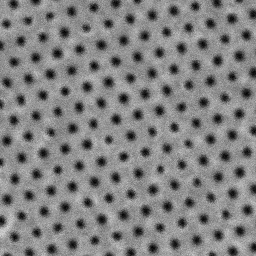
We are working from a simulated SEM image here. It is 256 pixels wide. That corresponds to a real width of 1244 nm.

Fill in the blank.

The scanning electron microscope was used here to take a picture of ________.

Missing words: a regular array of holes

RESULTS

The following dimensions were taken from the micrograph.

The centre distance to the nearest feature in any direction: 106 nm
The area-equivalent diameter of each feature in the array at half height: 0.0469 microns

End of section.